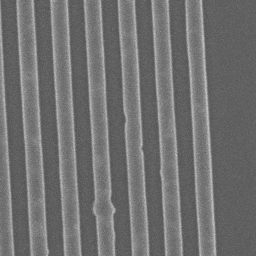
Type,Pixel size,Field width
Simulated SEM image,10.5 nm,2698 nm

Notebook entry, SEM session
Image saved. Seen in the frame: parallel lines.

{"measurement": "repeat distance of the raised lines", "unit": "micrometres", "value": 0.355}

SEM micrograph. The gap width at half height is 188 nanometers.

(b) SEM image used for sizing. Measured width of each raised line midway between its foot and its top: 15.9 pixels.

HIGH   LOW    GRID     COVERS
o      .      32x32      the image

..oo..oo...oo..oo..oo..oo.......
..oo..oo...oo..oo..oo..oo.......
..oo...o...oo..oo..oo..oo.......
..oo...o...oo..oo..oo..oo.......
..oo...oo..oo..oo..oo..oo.......
..oo...oo..oo..oo..oo..oo.......
...o...oo..oo..oo..oo...oo......
...o...oo..oo..oo..oo...oo......
...oo..oo..oo..oo...o...oo......
...oo..oo..oo..oo...o...oo......
...oo..oo..oo..oo...oo..oo......
...oo..oo..oo..oo...oo..oo......
o..oo..oo..oo...o...oo..oo......
o..oo..oo..oo...oo..oo..oo......
o..oo..oo..oo...oo..oo..oo......
o..oo..oo..oo...oo..oo..oo......
o..oo..oo...o...oo..oo..oo......
o..oo..oo...oo..oo..oo..oo......
o..oo..oo...oo..oo..oo..oo......
o..oo..oo...oo..oo..oo..oo......
o..oo...o...oo..oo..oo..oo......
o..oo...oo..oo..oo..oo..oo......
o..oo...oo..oo..oo..oo..oo......
o..ooo..oo..oo..oo..oo..ooo.....
o...oo..oo..oo..oo..oo...oo.....
o...oo..oo..oo..oo..oo...oo.....
o...oo..oo..oo..oo...o...oo.....
o...oo..oo..oo..oo...oo..oo.....
o...oo..oo..oo..oo...oo..oo.....
oo..oo..oo..oo..oo...oo..oo.....
oo..oo..oo..oo...o...oo..oo.....
oo..oo..oo..oo...oo..oo..oo.....